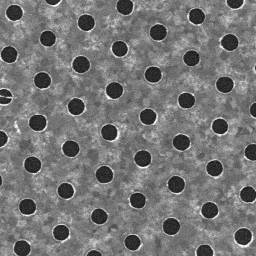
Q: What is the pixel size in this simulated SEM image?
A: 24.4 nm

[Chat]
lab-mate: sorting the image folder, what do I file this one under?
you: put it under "a regular array of holes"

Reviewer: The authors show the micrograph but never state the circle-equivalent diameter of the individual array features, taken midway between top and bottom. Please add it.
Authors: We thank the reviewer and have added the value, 416 nanometers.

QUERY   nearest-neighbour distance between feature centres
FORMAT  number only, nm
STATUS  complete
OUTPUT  1020